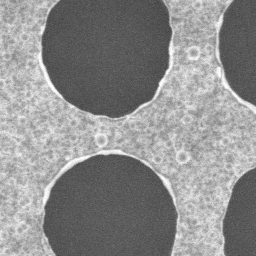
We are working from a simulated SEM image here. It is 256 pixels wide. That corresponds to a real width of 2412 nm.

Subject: holes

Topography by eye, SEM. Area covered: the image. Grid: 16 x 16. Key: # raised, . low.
###.......####..
###........###..
###........###..
###........###..
###.......####..
###.......####..
####.....######.
################
################
################
####.....#######
###.......#####.
###........###..
###........###..
###........###..
###........###..